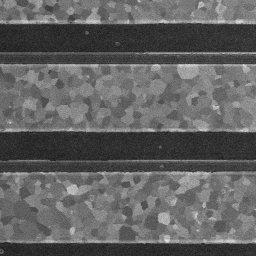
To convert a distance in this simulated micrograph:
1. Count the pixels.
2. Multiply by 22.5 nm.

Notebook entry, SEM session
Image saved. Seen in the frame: lines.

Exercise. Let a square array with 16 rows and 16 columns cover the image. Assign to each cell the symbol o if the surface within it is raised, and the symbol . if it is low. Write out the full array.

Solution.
oooooooooooooooo
................
................
................
oooooooooooooooo
oooooooooooooooo
oooooooooooooooo
oooooooooooooooo
................
................
................
oooooooooooooooo
oooooooooooooooo
oooooooooooooooo
oooooooooooooooo
................